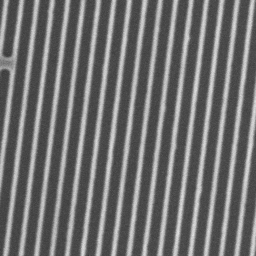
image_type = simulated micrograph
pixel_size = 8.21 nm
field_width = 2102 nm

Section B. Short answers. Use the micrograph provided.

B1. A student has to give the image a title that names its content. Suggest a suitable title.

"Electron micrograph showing parallel lines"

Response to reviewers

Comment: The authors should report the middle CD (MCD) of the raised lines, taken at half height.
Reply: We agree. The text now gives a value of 28.6 nm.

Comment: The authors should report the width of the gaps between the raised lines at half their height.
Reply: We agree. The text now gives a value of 98.8 nanometres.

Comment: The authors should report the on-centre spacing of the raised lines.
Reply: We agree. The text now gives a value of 0.126 µm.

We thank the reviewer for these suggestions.